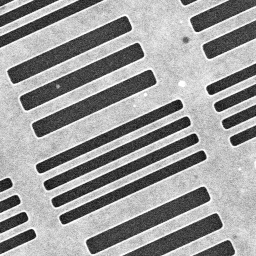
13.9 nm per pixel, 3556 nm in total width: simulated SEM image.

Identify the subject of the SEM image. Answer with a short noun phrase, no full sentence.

groups of lines, slits or small figures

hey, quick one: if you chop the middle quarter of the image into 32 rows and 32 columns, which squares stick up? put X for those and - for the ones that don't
XXXXX----------XXXXXXXXXXXXXXXXX
XXX-----------XXXXXXXXXXXXXXXXXX
X----------XXXXXXX----XXXXXXXXXX
---------XXXXXXX-------XXXXXXXXX
-------XXXXXXX---------XXXXXXXXX
-----XXXXXXX----------XXXXXXXXXX
--XXXXXXXX----------XXXXXXXXXXXX
XXXXXXX-----------XXXXXXXXXXXXXX
XXXXXX----------XXXXXXXXXXXXXXXX
XXX-----------XXXXXXXXXXXXX---XX
X----------XXXXXXXXXXXXXX-----XX
---------XXXXXXXXXXXXX-------XXX
-------XXXXXXXXXXXXX-------XXXXX
-----XXXXXXXXXXXXX-------XXXX--X
---XXXXXXXXXXXXX-------XXXX-----
XXXXXXXXXXXXXX------XXXXX------X
XXXXXXXXXXX-------XXXXX-------XX
XXXXXXXXXX------XXXXX------XXXXX
XXXXXXX-------XXXX-------XXXXX--
XXXXX-------XXXX-------XXXX-----
XXX-------XXXX-------XXXX-------
X-------XXXX-------XXXX-------XX
-----XXXXX-------XXXX-------XXXX
---XXXX-------XXXX-------XXXXX--
-XXXX-------XXXXX------XXXXX----
XXX-------XXXX-------XXXXX------
X-------XXXX-------XXXX-------XX
------XXXX-------XXXX-------XXXX
---XXXXX-------XXXX-------XXXXXX
-XXXXX-------XXXX-------XXXXXXXX
XXX-------XXXXX------XXXXXXXXXXX
X-------XXXX-------XXXXXXXXXXXXX